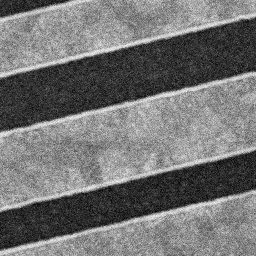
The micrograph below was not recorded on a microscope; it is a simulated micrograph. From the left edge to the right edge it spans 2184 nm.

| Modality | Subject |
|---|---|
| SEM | one or a few lines or trenches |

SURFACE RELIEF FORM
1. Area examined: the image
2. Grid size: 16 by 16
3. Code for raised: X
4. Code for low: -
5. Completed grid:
---XXXXXXXXXXXXX
XXXXXXXXXXXXX---
XXXXXXXXX-------
XXXXX-----------
X---------------
------------XXXX
--------XXXXXXXX
----XXXXXXXXXXXX
XXXXXXXXXXXXXXXX
XXXXXXXXXXXXXXX-
XXXXXXXXXXX-----
XXXXXXX---------
XX------------XX
----------XXXXXX
-----XXXXXXXXXXX
-XXXXXXXXXXXXXXX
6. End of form